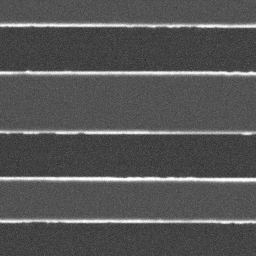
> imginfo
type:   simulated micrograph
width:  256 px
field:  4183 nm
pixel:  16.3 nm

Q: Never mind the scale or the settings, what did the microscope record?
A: lines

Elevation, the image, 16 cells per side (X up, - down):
XXXXXXXXXXXXXXXX
XXXXXXXXXXXXXXXX
----------------
----------------
----------------
XXXXXXXXXXXXXXXX
XXXXXXXXXXXXXXXX
XXXXXXXXXXXXXXXX
----------------
----------------
----------------
XXXXXXXXXXXXXXXX
XXXXXXXXXXXXXXXX
XXXXXXXXXXXXXXXX
----------------
----------------